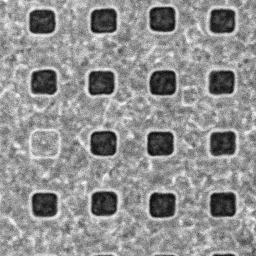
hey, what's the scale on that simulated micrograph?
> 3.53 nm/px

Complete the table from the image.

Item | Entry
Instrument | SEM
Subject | a regular array of holes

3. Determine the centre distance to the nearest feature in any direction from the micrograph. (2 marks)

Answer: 207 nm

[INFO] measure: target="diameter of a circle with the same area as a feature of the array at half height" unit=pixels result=29.3